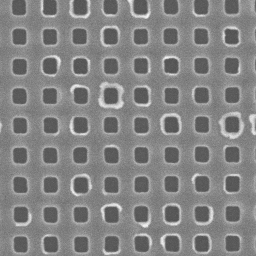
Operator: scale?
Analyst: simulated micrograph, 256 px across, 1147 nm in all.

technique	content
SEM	a regular array of holes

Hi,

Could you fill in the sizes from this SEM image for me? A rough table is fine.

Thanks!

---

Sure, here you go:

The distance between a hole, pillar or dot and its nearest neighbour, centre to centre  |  131 nanometers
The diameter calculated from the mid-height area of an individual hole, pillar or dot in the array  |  74 nanometres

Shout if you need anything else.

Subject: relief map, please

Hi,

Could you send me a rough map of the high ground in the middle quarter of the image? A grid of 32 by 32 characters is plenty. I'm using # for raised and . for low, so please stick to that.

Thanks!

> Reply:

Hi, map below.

##....####....###....####....###
##....####....###....####....###
###...####...######.############
################################
################################
################################
###...####...####....####....###
##....####....###....####....###
##....####....###....####....###
###...####...#####...####....###
################################
################################
################################
###...####...#####...####...####
##....####....###....####....###
##....####....###....####....###
##....####...#####...####....###
################################
################################
################################
################################
##....####....####...####....###
##....####....####...####....###
##....####....####...####....###
##....#####...####...####....###
################################
################################
################################
###..#####....####...####....###
##....####....####...####....###
##....####....####...####....###
##....####....####...####....###